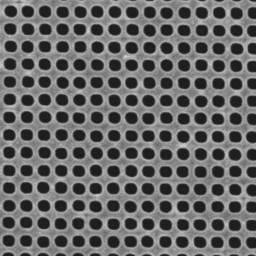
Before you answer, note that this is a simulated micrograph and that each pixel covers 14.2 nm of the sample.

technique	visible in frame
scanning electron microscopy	a regular array of holes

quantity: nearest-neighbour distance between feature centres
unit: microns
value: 0.241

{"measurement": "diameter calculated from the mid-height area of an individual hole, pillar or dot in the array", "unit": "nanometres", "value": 176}